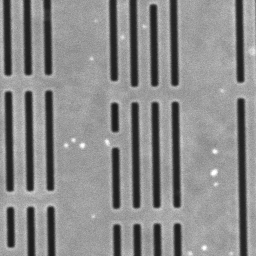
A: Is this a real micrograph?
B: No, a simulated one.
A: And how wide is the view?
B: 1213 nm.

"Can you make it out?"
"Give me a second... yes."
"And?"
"groups of lines, slits or small figures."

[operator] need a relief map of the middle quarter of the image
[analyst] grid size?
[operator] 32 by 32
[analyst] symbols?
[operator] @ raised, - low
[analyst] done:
@@@@@@@@@@@---@@---@@---@@@--@@@
@@@@@@@@@@@---@@---@@---@@@--@@@
@@@@@@@@@@@---@@---@@---@@@--@@@
@@@@@@@@@@@---@@---@@---@@@--@@@
@@@@@@@@@@@@@@@@---@@---@@@--@@@
@@@@@@@@@@@@@@@@@-@@@@-@@@@-@@@@
@@@@@@@@@@@@@@@@@@@@@@@@@@@@@@@@
@@@@@@@@@@@@@@@@@@@@@@@@@@@@@@@@
@@@@@@@@@@@@@@@@@@@@@@@@@@@@@@@@
@@@@@@@@@@@@@@@@@-@@@@-@@@@-@@@@
@@@@@@@@@@@@--@@@--@@@--@@@--@@@
@@@@@@@@@@@@--@@@--@@@--@@@--@@@
@@@@@@@@@@@@--@@@--@@@--@@@--@@@
@@@@@@@@@@@@--@@@--@@@--@@@--@@@
@@@@@@@@@@@@--@@@--@@@--@@@--@@@
@@@@@@@@@@@@--@@@--@@@--@@@--@@@
@@@@@@@@@@@@--@@@--@@@--@@@--@@@
@@@@@@@@@@@@@@@@@--@@@--@@@--@@@
@@@@@@@@@@@@@@@@@--@@@--@@@--@@@
@@@@@@@@@@@@@@@@@--@@@--@@@--@@@
@@@@@@@@@@@@@@@@@--@@@--@@@--@@@
@@@@@@@@@@@@--@@@--@@@--@@@--@@@
@@@@@@@@@@@@--@@@--@@@--@@@--@@@
@@@@@@@@@@@@--@@@--@@@--@@@--@@@
@@@@@@@@@@@@--@@@--@@@--@@@--@@@
@@@@@@@@@@@@--@@@--@@@--@@@--@@@
@@@@@@@@@@@@--@@@--@@@--@@@--@@@
@@@@@@@@@@@@--@@@--@@@--@@@--@@@
@@@@@@@@@@@@--@@@--@@@--@@@--@@@
@@@@@@@@@@@@--@@@--@@@--@@@--@@@
@@@@@@@@@@@@--@@@--@@@--@@@--@@@
@@@@@@@@@@@@--@@@--@@@--@@@--@@@